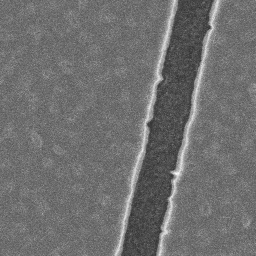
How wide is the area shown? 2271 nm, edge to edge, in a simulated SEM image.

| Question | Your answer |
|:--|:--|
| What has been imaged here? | one or a few lines or trenches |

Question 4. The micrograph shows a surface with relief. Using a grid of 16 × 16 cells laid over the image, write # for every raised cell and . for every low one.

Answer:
###########..###
###########..###
##########...###
##########...###
##########..####
##########..####
##########..####
#########...####
#########...####
#########..#####
#########..#####
########...#####
########...#####
########..######
########..######
########..######